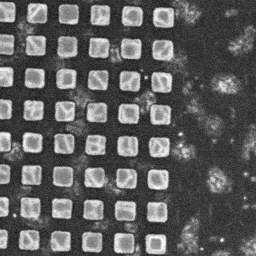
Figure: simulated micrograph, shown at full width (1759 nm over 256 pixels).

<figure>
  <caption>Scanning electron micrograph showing a regular array of raised bodies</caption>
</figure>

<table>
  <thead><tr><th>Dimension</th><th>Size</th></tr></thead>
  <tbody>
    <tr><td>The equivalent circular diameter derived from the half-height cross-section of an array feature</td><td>142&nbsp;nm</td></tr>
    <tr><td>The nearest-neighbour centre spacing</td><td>0.217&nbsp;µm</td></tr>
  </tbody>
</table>